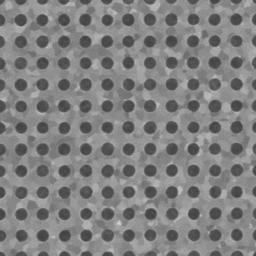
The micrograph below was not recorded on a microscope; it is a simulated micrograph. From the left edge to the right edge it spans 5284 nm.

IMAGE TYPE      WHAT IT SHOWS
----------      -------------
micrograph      a regular array of holes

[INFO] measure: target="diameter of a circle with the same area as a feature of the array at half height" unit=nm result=258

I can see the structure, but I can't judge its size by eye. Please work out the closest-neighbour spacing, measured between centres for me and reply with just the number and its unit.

439 nm